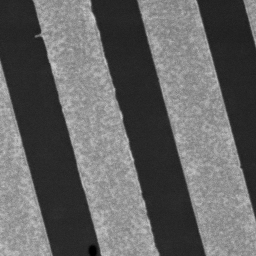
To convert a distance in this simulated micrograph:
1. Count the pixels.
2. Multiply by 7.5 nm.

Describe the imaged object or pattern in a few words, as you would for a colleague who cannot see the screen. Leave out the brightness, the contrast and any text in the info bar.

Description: one or a few lines or trenches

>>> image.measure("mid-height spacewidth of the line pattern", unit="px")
47.1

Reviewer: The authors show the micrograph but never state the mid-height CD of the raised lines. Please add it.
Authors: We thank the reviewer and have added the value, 0.414 um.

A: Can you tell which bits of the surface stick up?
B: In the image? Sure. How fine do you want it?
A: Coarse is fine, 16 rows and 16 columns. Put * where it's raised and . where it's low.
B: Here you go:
..****...***...*
..****...****...
...***...****...
...***....***...
...****...***...
....***...****..
*...***...****..
*...****...***..
*...****...****.
**...***...****.
**...***...****.
**...****...***.
**...****...****
***...***...****
***...***....***
***...****...***